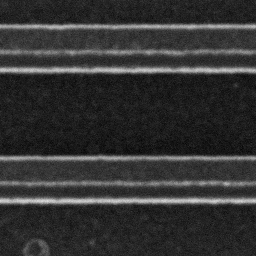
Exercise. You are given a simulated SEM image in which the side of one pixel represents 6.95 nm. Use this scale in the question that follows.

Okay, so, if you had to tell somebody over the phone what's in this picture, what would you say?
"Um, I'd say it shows lines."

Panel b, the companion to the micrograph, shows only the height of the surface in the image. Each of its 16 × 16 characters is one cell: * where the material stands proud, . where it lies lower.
................
................
****************
****************
................
................
................
................
................
................
****************
****************
****************
................
................
................